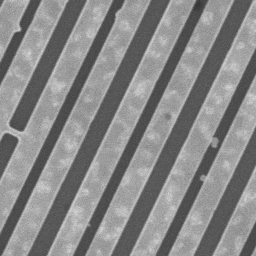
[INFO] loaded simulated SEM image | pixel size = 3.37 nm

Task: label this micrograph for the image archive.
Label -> parallel lines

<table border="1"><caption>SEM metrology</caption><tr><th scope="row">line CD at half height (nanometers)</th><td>74.7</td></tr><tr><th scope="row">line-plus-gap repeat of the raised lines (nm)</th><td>126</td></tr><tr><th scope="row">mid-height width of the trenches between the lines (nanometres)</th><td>50.4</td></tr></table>